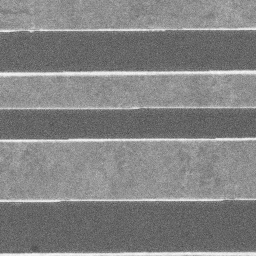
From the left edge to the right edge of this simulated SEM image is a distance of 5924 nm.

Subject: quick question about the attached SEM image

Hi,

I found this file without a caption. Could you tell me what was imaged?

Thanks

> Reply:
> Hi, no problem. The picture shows lines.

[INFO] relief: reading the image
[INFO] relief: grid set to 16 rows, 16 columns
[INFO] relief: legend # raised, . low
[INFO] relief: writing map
################
################
................
................
................
################
################
................
................
################
################
################
##############..
................
................
................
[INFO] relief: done